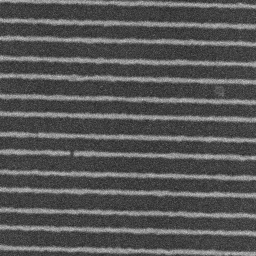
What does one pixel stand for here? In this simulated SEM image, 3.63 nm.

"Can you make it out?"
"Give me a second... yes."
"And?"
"parallel lines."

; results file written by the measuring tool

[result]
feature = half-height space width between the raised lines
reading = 58.6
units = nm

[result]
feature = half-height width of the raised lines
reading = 3.39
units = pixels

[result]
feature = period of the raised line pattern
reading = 69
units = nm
